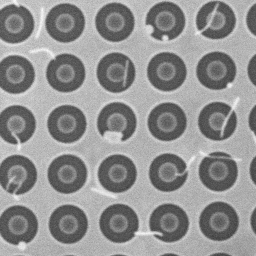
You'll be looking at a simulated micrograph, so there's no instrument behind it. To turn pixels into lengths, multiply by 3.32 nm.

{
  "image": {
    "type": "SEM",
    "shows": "an array of small figures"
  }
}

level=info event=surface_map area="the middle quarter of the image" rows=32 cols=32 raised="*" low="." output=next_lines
**...***....**....***...***...**
**...***...****...***..*****...*
**...***...****...***..*****...*
**...***...****...***...***...**
*....****........****.........**
....*****........*****.......***
...*******......*******.....****
********************************
********************************
************...**********..*****
...*******......*******......***
....*****........*****........**
.....****.........***....**...**
**...***...****...***...****...*
***...**...****...***..*****...*
***...**...****...***...****...*
**...***....***...***....**...**
.....****.****...*****........**
....**********...******......***
...*****************************
********************************
********************************
...*********..**********....****
....******......*******......***
.....****........*****........**
......***...***...***....***...*
***...**....***...***...****...*
***...**...****...***...****...*
***...**....***...***...****...*
**....***....*....****........**
.....****........*****........**
....******......********....****